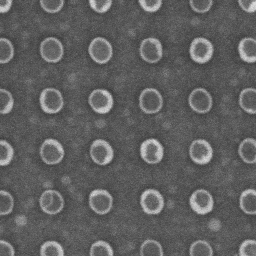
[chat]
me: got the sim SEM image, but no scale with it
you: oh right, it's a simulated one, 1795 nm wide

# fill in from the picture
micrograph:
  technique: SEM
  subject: a regular array of raised bodies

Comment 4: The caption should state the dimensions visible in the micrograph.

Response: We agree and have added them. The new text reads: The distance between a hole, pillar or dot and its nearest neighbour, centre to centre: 0.347 µm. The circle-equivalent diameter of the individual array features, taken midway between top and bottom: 160 nm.